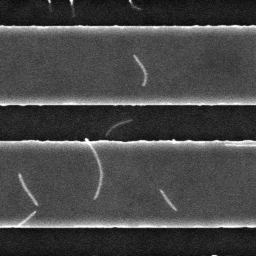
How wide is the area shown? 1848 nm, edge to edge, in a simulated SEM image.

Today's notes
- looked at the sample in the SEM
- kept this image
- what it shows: lines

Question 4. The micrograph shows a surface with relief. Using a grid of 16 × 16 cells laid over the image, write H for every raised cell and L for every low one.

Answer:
LLLLLLLLLLLLLLLL
LLLLLLLLLLLLLLLL
HHHHHHHHHHHHHHHH
HHHHHHHHHHHHHHHH
HHHHHHHHHHHHHHHH
HHHHHHHHHHHHHHHH
HHHHHHHHHHHHHHHH
LLLLLLLLLLLLLLLL
LLLLLLLLLLLLLLLL
HHHHHHHHHHHHHHHH
HHHHHHHHHHHHHHHH
HHHHHHHHHHHHHHHH
HHHHHHHHHHHHHHHH
HHHHHHHHHHHHHHHH
LLLLLLLLLLLLLLLL
LLLLLLLLLLLLLLLL